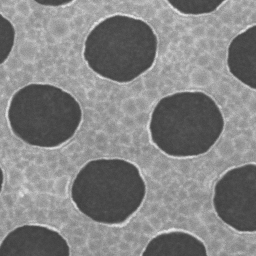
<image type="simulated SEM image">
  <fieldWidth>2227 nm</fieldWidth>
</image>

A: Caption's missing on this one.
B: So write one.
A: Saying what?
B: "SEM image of holes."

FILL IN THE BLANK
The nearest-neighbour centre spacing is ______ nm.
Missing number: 866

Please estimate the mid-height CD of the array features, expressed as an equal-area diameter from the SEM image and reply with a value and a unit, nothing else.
0.602 um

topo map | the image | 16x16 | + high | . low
+++++++++++...++
.+++++...+++++++
.++++.....+++++.
.++++.....++++..
++++++...+++++..
+...++++++++++++
+....+++++...+++
+....++++.....++
+...+++++.....++
++++++++++...+++
+++++...+++++++.
+++++....+++++..
+++++....++++...
+++++...++++++..
+..+++++++++++++
....+++++....+++